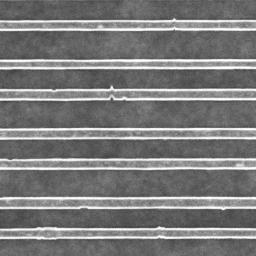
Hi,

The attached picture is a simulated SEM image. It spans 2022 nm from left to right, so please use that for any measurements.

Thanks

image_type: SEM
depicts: parallel lines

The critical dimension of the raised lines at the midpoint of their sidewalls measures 74.1 nanometers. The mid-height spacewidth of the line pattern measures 0.197 um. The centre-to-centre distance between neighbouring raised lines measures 274 nm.